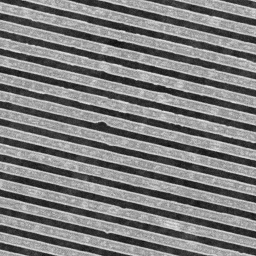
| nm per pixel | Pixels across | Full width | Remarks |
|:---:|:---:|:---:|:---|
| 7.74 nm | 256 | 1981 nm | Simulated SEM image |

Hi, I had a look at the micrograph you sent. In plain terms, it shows parallel lines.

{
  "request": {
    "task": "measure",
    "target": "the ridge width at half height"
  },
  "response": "68.8 nanometers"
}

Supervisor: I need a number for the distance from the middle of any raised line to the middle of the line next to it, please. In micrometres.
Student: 0.133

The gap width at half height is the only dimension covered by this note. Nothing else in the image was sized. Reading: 61.3 nm